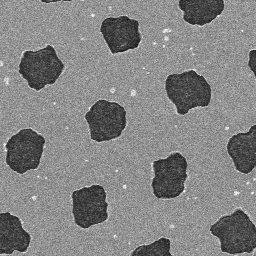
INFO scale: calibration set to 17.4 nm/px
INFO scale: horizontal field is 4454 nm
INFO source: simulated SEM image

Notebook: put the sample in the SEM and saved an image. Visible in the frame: holes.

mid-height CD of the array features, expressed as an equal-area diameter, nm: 708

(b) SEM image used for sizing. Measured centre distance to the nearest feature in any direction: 84.8 pixels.